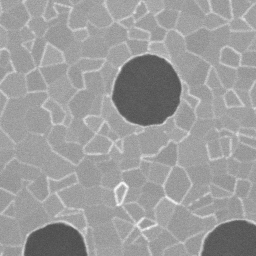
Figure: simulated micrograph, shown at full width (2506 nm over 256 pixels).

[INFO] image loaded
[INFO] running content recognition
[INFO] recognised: holes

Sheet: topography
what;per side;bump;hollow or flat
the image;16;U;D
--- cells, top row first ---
UUUUUUUUUUUUUUUU
UUUUUUUUUUUUUUUU
UUUUUUUUUUUUUUUU
UUUUUUUUUDUUUUUU
UUUUUUUDDDDUUUUU
UUUUUUUDDDDUUUUU
UUUUUUUDDDDUUUUU
UUUUUUUUDDUUUUUU
UUUUUUUUUUUUUUUU
UUUUUUUUUUUUUUUU
UUUUUUUUUUUUUUUU
UUUUUUUUUUUUUUUU
UUUUUUUUUUUUUUUU
UUUUUUUUUUUUUUUU
UUDDDUUUUUUUUDDD
UUDDDUUUUUUUUDDD